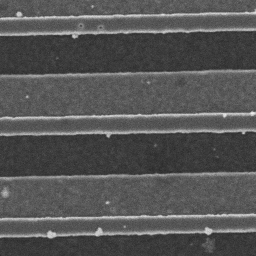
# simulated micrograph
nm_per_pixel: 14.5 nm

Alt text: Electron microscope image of lines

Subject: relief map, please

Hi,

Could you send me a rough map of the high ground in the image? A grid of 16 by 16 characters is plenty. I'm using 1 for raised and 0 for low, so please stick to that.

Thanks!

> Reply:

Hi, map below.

1111111111111111
1111111111111111
0000000000000000
0000000000000000
0000000000001111
1111111111111111
1111111111111111
1111111111111111
0000000000000000
0000000000000000
0000000000000000
1111111111111111
1111111111111111
1111111111111111
1111111111111100
0000000000000000